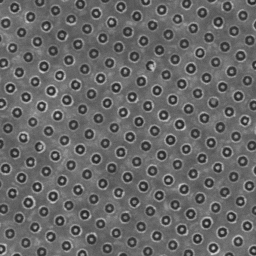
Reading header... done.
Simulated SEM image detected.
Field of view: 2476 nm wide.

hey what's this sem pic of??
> a regular array of ring-shaped grooves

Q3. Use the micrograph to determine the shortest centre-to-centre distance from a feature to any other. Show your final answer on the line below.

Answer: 172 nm